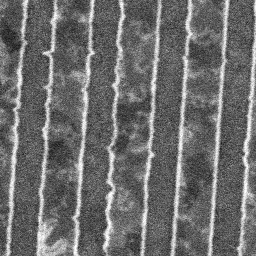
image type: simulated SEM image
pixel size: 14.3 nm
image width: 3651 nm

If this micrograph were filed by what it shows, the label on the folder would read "one or a few lines or trenches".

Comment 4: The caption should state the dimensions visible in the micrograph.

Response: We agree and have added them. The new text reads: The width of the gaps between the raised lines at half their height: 428 nm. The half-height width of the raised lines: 526 nanometres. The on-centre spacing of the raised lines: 0.959 microns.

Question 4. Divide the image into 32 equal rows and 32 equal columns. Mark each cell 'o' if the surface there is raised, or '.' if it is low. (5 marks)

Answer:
ooo....ooooo...ooooo....oooo....
ooo....oooo....ooooo....oooo....
ooo....oooo....ooooo....oooo....
ooo....oooo....ooooo...ooooo....
ooo....oooo....ooooo....oooo....
ooo....oooo....ooooo...ooooo....
ooo...ooooo....ooooo...ooooo....
ooo...ooooo....ooooo...ooooo....
ooo...ooooo....oooo....ooooo....
oo....ooooo....oooo....ooooo....
oo....ooooo...ooooo....ooooo....
oo....ooooo....oooo....ooooo....
oo....ooooo...ooooo....oooo....o
oo....ooooo...ooooo....oooo....o
oo....ooooo...ooooo....oooo....o
oo....ooooo...ooooo....oooo....o
oo....oooo.....oooo....oooo....o
oo....oooo....ooooo....oooo....o
oo....oooo....ooooo....oooo....o
oo....oooo....ooooo...ooooo....o
oo....oooo....ooooo...ooooo....o
oo...ooooo....oooo....ooooo....o
oo...ooooo....oooo....ooooo....o
o....ooooo....oooo....ooooo....o
o....ooooo....oooo....ooooo....o
o....ooooo....oooo....ooooo...oo
o....ooooo...ooooo....ooooo...oo
o....oooo.....oooo....ooooo...oo
o....ooooo....oooo....oooo....oo
o....ooooo...ooooo....oooo....oo
o....oooo....ooooo....oooo....oo
o....oooo....ooooo....oooo....oo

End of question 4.